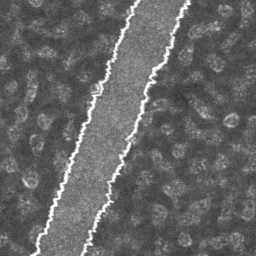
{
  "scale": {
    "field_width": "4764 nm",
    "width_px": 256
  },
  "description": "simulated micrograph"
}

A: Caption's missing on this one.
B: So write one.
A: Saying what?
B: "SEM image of one or a few lines or trenches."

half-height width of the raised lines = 870 nm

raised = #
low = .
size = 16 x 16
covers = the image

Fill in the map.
........####....
........###.....
.......####.....
.......###......
.......###......
......###.......
......###.......
.....####.......
.....###........
.....###........
....###.........
....###.........
....###.........
...###..........
...###..........
..###...........